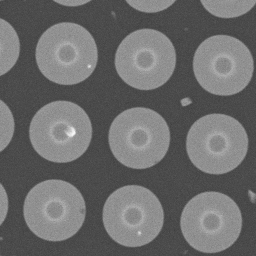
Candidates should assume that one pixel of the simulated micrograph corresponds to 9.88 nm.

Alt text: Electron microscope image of an array of small figures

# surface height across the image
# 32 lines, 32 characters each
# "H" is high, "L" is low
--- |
LLLLLLLLHHLLLLLLHHHHHLLLLHHHHHHH
LLLLLLLLLLLLLLLLLLHHLLLLLLHHHHHL
LLLLLLLLLLLLLLLLLLLLLLLLLLLLLLLL
HHLLLLHHHHLLLLLLLLLLLLLLLLLLLLLL
HHLLLHHHHHHLLLLLHHHHHLLLLLLHHLLL
HHLLLHHHHHHHLLLHHHHHHHLLLHHHHHLL
HHLLHHHHHHHHLLLHHHHHHHLLHHHHHHHL
HHLLLHHHHHHHLLHHHHHHHHLLHHHHHHHH
HLLLLHHHHHHHLLHHHHHHHHLLHHHHHHHH
LLLLLLHHHHHLLLLHHHHHHLLLHHHHHHHL
LLLLLLLLHLLLLLLLHHHHLLLLLHHHHHHL
LLLLLLLLLLLLLLLLLLLLLLLLLLHHHHLL
LLLLLLLLLLLLLLLLLLLLLLLLLLLLLLLL
HLLLLHHHHHLLLLLLLHLLLLLLLLLLLLLL
HHLLHHHHHHHLLLLHHHHHLLLLLLHHHLLL
HHLLHHHHHHHLLLHHHHHHHLLLHHHHHHLL
HHLLHHHHHHHLLLHHHHHHHLLLHHHHHHHL
HLLLHHHHHHHLLLHHHHHHHLLHHHHHHHHL
HLLLHHHHHHHLLLHHHHHHHLLHHHHHHHHL
LLLLLHHHHHLLLLHHHHHHLLLLHHHHHHHL
LLLLLLLLLLLLLLLHHHHLLLLLHHHHHHLL
LLLLLLLLLLLLLLLLLLLLLLLLLLHHLLLL
LLLLLLHLLLLLLLLLLLLLLLLLLLLLLLLL
LLLLHHHHHLLLLLLHHHLLLLLLLLLLLLLL
HLLHHHHHHHLLLLHHHHHLLLLLHHHHLLLL
HLLHHHHHHHHLLHHHHHHHLLLHHHHHHLLL
HLLHHHHHHHHLLHHHHHHHLLLHHHHHHHLL
HLLHHHHHHHLLLHHHHHHHLLLHHHHHHHLL
LLLLHHHHHHLLLHHHHHHHLLLHHHHHHHLL
LLLLLHHHHLLLLLHHHHHHLLLHHHHHHHLL
LLLLLLLLLLLLLLLHHHLLLLLLHHHHHLLL
LLLLLLLLLLLLLLLLLLLLLLLLLHHLLLLL